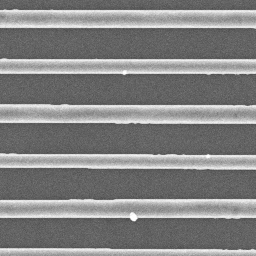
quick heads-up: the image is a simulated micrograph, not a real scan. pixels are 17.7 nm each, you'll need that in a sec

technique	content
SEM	lines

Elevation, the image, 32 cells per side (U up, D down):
DDDDDDDDDDDDDDDDDDDDDDDDDDDDDDDD
UUUUUUUUUUUUUUUUUUUUUUUUUUUUUUUU
UUUUUUUUUUUUUUUUUUUUUUUUUUUUUUUU
DDDDDDDDDDDDDDDDDDDDDDDDDDDDDDDD
DDDDDDDDDDDDDDDDDDDDDDDDDDDDDDDD
DDDDDDDDDDDDDDDDDDDDDDDDDDDDDDDD
DDDDDDDDDDDDDDDDDDDDDDDDDDDDDDDD
UUUUUUUUUUUUUUUUUUUUUUUUUUUUUUUU
UUUUUUUUUUUUUUUUUUUUUUUUUUUUUUUU
DDDDDDDDDDDDDDDDDDDDDDDDDDDDDDDD
DDDDDDDDDDDDDDDDDDDDDDDDDDDDDDDD
DDDDDDDDDDDDDDDDDDDDDDDDDDDDDDDD
DDDDDDDDDDDDDDDDDDDDDDDDDDDDDDDD
UUUUUUUUUUUUUUUUUUUUUUUUUUUUUUUU
UUUUUUUUUUUUUUUUUUUUUUUUUUUUUUUU
DDDDDDDDDDDDDDDDDDDDDDDDDDDDDDDD
DDDDDDDDDDDDDDDDDDDDDDDDDDDDDDDD
DDDDDDDDDDDDDDDDDDDDDDDDDDDDDDDD
DDDDDDDDDDDDDDDDDDDDDDDDDDDDDDDD
UUUUUUUUUUUUUUUUUUUUUUUUUUUUUUUU
UUUUUUUUUUUUUUUUUUUUUUUUUUUUUUUU
DDDDDDDDDDDDDDDDDDDDDDDDDDDDDDDD
DDDDDDDDDDDDDDDDDDDDDDDDDDDDDDDD
DDDDDDDDDDDDDDDDDDDDDDDDDDDDDDDD
DDDDDDDDDDDDDDDDDDDDDDDDDDDDDDDD
UUUUUUUUUUUUUUUUUUUUUUUUUUUUUUUU
UUUUUUUUUUUUUUUUUUUUUUUUUUUUUUUU
DDDDDDDDDDDDDDDDDDDDDDDDDDDDDDDD
DDDDDDDDDDDDDDDDDDDDDDDDDDDDDDDD
DDDDDDDDDDDDDDDDDDDDDDDDDDDDDDDD
DDDDDDDDDDDDDDDDDDDDDDDDDDDDDDDD
UUUUUUUUUUUUUUUUUUUUUUUUUUUUUUUU